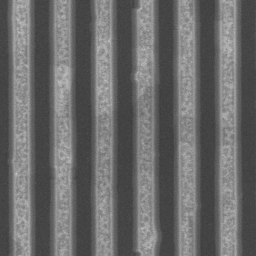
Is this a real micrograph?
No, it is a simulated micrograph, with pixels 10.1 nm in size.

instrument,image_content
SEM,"parallel lines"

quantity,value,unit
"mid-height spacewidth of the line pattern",220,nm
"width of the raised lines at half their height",0.201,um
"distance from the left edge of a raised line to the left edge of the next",417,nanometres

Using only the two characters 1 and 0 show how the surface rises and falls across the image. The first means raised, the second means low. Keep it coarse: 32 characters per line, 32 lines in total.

01110001100011000110001110011100
01110001100011000110001110011100
01110001100011000110001110011100
01110001100011000110001110011100
01110001100011000110001110011100
01110001100011000110001110011100
01110001100011000110001110011100
01110001100011000110001110011100
00110001100011000110001110011100
00110001100011000110001110011100
00110001100011000110001110011100
00110001100011000110001110011100
00110001100011000110001110011100
00110001100011000110001110011100
00110001100011000110001110011100
00110001100011000110001110011100
00110001100011000110001110011100
00110001100011000110001110011100
00110001100011000110001110011100
01110001100011000110001110011100
01110001100011000110001110011100
00110001100011000110001110011100
00110001100011000110001110011100
00110001100011000110001110011100
00110001100011000110001110011100
00110001100011000110001110011100
00110001100011000110001110011100
00110001100011000110001110011100
00110001100011000111001110011100
00110001100011000111001110011100
00110001100011000111001110011100
00110001100011000110001110011100